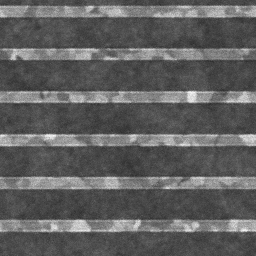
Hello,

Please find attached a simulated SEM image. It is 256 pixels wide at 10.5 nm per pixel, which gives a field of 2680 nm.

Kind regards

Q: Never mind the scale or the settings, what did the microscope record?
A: parallel lines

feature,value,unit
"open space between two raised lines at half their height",0.347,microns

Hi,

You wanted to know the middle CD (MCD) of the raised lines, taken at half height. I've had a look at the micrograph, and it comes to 102 nm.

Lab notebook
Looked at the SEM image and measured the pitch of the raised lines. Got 0.448 micrometres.